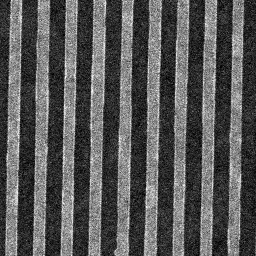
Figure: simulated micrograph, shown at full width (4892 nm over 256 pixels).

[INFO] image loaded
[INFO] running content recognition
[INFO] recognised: parallel lines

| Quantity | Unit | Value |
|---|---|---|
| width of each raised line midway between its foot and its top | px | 10.5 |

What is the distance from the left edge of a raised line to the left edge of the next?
531 nanometres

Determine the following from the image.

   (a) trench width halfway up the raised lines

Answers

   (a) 327 nm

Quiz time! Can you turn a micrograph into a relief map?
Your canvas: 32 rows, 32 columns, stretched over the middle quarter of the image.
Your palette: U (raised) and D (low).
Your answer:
DUUDDDDUUUDDDDUUUDDDDUUUDDDDUUUD
DUUDDDDUUUDDDDUUUDDDDUUUDDDDUUUD
UUUDDDDUUUDDDDUUUDDDDUUUDDDDUUUD
UUUDDDDUUUDDDDUUUDDDDUUUDDDDUUUD
UUUDDDDUUUDDDDUUUDDDDUUUDDDDUUUD
UUUDDDDUUUDDDDUUUDDDDUUUDDDDUUUD
UUUDDDDUUUDDDDUUUDDDDUUUDDDDUUUD
UUUDDDDUUUDDDDUUUDDDDUUUDDDDUUDD
UUUDDDDUUUDDDDUUUDDDDUUUDDDDUUDD
UUUDDDDUUUDDDDUUUDDDDUUUDDDDUUDD
UUDDDDDUUUDDDDUUUDDDDUUUDDDDUUDD
UUDDDDDUUUDDDDUUUDDDDUUDDDDDUUDD
UUDDDDDUUUDDDDUUUDDDDUUDDDDDUUDD
UUDDDDDUUUDDDDUUUDDDDUUDDDDDUUDD
UUDDDDDUUUDDDDUUDDDDDUUDDDDDUUDD
UUDDDDDUUUDDDDUUDDDDDUUDDDDDUUDD
UUDDDDDUUUDDDDUUDDDDDUUDDDDDUUDD
UUDDDDDUUUDDDDUUDDDDDUUDDDDDUUDD
UUDDDDDUUDDDDDUUDDDDDUUDDDDDUUDD
UUDDDDDUUDDDDDUUDDDDDUUDDDDDUUDD
UUDDDDDUUDDDDDUUDDDDDUUDDDDDUUDD
UUDDDDDUUDDDDDUUDDDDDUUDDDDDUUDD
UUDDDDDUUDDDDDUUDDDDDUUDDDDDUUDD
UUDDDDDUUDDDDDUUDDDDDUUDDDDDUUDD
UUDDDDDUUDDDDDUUDDDDDUUDDDDDUUDD
UUDDDDDUUDDDDDUUDDDDDUUDDDDDUUDD
UUDDDDDUUDDDDDUUDDDDDUUDDDDDUUDD
UUDDDDDUUDDDDDUUDDDDDUUDDDDDUUDD
UUDDDDDUUDDDDDUUDDDDDUUDDDDDUUDD
UUDDDDDUUDDDDDUUDDDDDUUDDDDDUUDD
UUDDDDDUUDDDDDUUDDDDDUUDDDDDUUDD
UUDDDDDUUDDDDDUUDDDDDUUDDDDDUUDD